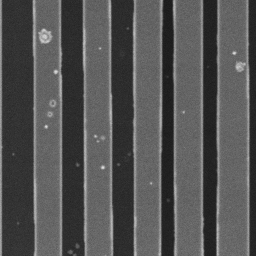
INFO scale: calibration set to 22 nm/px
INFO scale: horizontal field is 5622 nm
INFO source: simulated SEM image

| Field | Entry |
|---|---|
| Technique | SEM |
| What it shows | lines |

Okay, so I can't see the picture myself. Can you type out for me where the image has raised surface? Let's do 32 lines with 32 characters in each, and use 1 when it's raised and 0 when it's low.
00001111001111000111001110011110
00001111001111000111001110011110
00001111001111000111001110011110
00001111001111000111001110011110
00001111001111000111001110011110
00001111001111000111001110011110
00001111001111000111001110011110
00001111001111000111001110011110
00001111001111000111001110011110
00001111000111000111001110011110
00001111000111000111001110011110
00001111000111000111001110011110
00001111000111000111001110011110
00001111000111000111001110011110
00001111000111000111001110011110
00001111000111000111001110011110
00001111000111000111001110011110
00001111000111000111001110011110
00001111000111000111001110011110
00001111000111000111001110011110
00001111000111000111001110011110
00001111000111000111001110011110
00001111000111000111001110011110
00001111000111000111001110011110
00001111000111000111001110011110
00001111000111000111001110011110
00001111000111000111001110011110
00001111000111000111001110011110
00001111000111000111001110011110
00001111000111000111001110011110
00001111000111000111001110011110
00001111000111000111001110011110